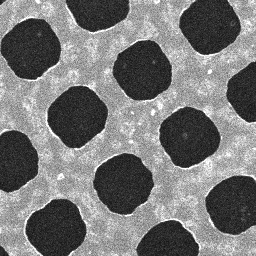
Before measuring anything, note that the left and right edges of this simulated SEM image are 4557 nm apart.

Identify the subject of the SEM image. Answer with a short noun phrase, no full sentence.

holes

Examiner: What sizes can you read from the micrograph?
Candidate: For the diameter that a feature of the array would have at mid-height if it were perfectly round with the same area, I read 59.2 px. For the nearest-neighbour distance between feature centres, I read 1.43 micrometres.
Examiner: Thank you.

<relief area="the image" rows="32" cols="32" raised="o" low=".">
oooooooo........oooooooo.....ooo
ooooooooo.......ooooooo......ooo
ooo...ooo......ooooooo........oo
oo....oooo....oooooooo........oo
o......oooooooooooooooo.......oo
........ooooooooo...oooo.....ooo
........ooooooo.....ooooo..ooooo
o......ooooooo.......ooooooooooo
o.....oooooooo.......ooooooooo..
oo...ooooooooo.......oooooooo...
ooooooooooooooo......ooooooo....
oooooooo....oooo....oooooooo....
ooooooo......oooo..ooooooooo....
oooooo.......oooooooooo.ooooo...
oooooo.......oooooooo.....oooo..
oooooo.......ooooooo.......ooooo
o..oooo......ooooooo.......ooooo
....oooo...ooooooooo........oooo
....ooooo.oooooooooo.......ooooo
.....ooooooooo...oooo.....oooooo
.....oooooooo.....oooo...ooooooo
.....ooooooo.......ooooooooooooo
....oooooooo.......ooooooooo....
...ooooooooo.......oooooooo.....
oooooooooooo.......ooooooo......
oooooo...oooo.....oooooooo......
oooo......oooo...ooooooooo......
ooo.......ooooooooooo.oooo......
ooo........oooooooo....oooo....o
ooo........ooooooo......oooooooo
oooo......ooooooo........ooooooo
.oooo....oooooooo........ooooooo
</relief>